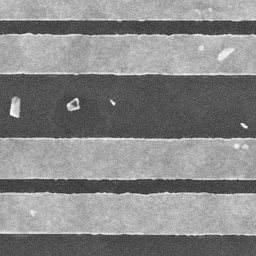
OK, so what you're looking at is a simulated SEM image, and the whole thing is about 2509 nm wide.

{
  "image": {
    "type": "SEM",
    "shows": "lines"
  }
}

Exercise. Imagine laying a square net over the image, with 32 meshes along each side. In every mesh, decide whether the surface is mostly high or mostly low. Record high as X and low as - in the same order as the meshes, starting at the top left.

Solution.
XXXXXXXXXXXXXXXXXXXXXXXXXXXXXXXX
XXXXXXXXXXXXXXXXXXXXXXXXXXXXXXXX
-----------------X------XX---XX-
--------------------------------
XXXXXXXXXXXXXXXXXXXXXXXXXXXXXXXX
XXXXXXXXXXXXXXXXXXXXXXXXXXXXXXXX
XXXXXXXXXXXXXXXXXXXXXXXXXXXXXXXX
XXXXXXXXXXXXXXXXXXXXXXXXXXXXXXXX
XXXXXXXXXXXXXXXXXXXXXXXXXXXXXXXX
--------------------------------
--------------------------------
--------------------------------
--------------------------------
-X-------X----------------------
--------------------------------
--------------------------------
--------------------------------
XXXXXXXXXXXXXXXXXXXXXXXXXXXXXXXX
XXXXXXXXXXXXXXXXXXXXXXXXXXXXXXXX
XXXXXXXXXXXXXXXXXXXXXXXXXXXXXXXX
XXXXXXXXXXXXXXXXXXXXXXXXXXXXXXXX
XXXXXXXXXXXXXXXXXXXXXXXXXXXXXXXX
--------------------------------
--------------------------------
XXXXXXXXXXXXXXXXXXXXXXXXXXXXXXXX
XXXXXXXXXXXXXXXXXXXXXXXXXXXXXXXX
XXXXXXXXXXXXXXXXXXXXXXXXXXXXXXXX
XXXXXXXXXXXXXXXXXXXXXXXXXXXXXXXX
XXXXXXXXXXXXXXXXXXXXXXXXXXXXXXXX
--------------------------------
--------------------------------
--------------------------------